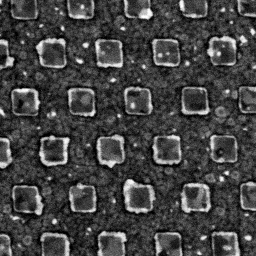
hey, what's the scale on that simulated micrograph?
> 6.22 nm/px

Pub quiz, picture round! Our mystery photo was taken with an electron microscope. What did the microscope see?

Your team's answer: a regular array of raised bodies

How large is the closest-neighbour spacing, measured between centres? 347 nm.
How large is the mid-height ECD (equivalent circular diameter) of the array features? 0.181 µm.